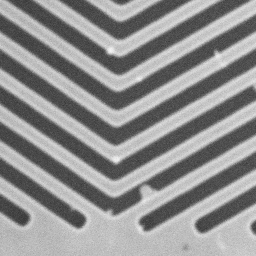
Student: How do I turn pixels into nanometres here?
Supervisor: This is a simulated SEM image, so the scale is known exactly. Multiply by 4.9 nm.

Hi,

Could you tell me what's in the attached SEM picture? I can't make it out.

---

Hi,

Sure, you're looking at groups of lines, slits or small figures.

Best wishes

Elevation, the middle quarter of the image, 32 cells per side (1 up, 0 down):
00001111100000000001111110000000
00000111111000000111111000000000
00000011111100001111110000000011
10000000111111111111000000001111
11000000011111111100000000011111
11100000000111110000000001111110
11111000000001000000000111111000
01111100000000000000001111110000
00111111000000000000111111000000
00011111100000000011111100000000
00000111111000001111111000000001
00000011111100011111100000000011
00000000111111111110000000001111
11000000011111111100000000111111
11100000000111110000000011111100
11111000000000000000000111111000
01111100000000000000011111100000
00111111000000000001111110000000
00001111100000000111111100000000
00000111111000011111110000000011
00000011111100111111000000000111
10000000111111111100000000011111
11000000011111111000000001111111
11100000000111100000000111111100
11111000000011000000001111110000
01111100000000000000111111000000
00111111000000000011111110000000
00011111100000000111111000000001
00000111111000011111100000000011
00000011111111111110000000001111
00000000111111111100000000111111
11000000011111110000000001111110